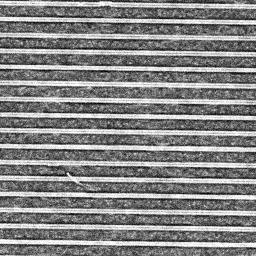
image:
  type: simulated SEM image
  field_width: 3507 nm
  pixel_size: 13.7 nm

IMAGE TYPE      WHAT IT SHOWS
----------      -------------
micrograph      parallel lines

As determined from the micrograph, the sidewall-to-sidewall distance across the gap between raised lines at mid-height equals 173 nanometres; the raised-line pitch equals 0.218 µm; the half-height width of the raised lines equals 48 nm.